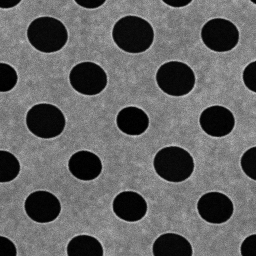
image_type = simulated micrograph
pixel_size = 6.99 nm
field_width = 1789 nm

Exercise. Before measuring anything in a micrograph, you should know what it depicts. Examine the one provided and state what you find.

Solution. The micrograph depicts a regular array of holes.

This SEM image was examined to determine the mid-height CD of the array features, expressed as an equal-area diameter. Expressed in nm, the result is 248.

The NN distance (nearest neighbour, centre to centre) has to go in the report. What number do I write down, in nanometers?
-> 418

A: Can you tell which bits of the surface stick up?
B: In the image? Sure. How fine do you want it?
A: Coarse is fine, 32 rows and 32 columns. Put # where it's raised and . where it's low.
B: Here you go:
..########...########...########
################################
####...########...########..####
####....######.....######.....##
###.....######.....######.....##
####....#######....#######....##
#####..#########..##############
################################
..#######....#######....#######.
..#######....#######....######..
..#######....#######....#######.
##########...########...########
################################
####...#########.#########..####
###.....#######...#######....###
###.....#######....######....###
####....#######...########...###
################################
#####################..########.
..#######...#######.....######..
..#######....######.....######..
..#######....#######....#######.
..########.##########..#########
################################
####...########...#######...####
###.....######....#######....###
###....#######....#######....###
####...#########.#########..####
################################
##########.#########...########.
..#######....######.....######..
..######.....######.....######..